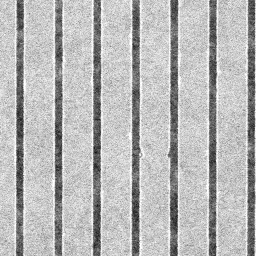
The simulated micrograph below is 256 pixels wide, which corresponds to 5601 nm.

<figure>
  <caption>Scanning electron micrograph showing parallel lines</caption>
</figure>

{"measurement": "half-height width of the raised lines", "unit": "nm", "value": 651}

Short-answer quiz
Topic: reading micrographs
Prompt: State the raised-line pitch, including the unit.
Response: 38.6 px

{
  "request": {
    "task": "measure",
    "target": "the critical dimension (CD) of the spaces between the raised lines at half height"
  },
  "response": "200 nm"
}